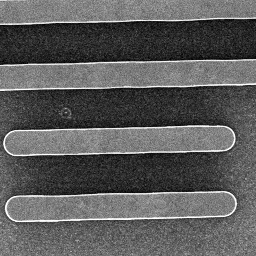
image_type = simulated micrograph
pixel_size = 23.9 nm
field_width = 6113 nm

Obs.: groups of lines, slits or small figures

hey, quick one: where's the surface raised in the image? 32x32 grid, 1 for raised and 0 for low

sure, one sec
11111111111111111111111111111111
11111111111111111111111111111111
11111111111111111111111100000000
00000000000000000000000000000000
00000000000000000000000000000000
00000000000000000000000000000000
00000000000000000000000000000000
00000000000000000000000000000011
11111111111111111111111111111111
11111111111111111111111111111111
11111111111111111111111111111110
00000000000000000000000000000000
00000000000000000000000000000000
00000000000000000000000000000000
00000000000000000000000000000000
00000000000000000000000000000000
01111111111111111111111111111000
01111111111111111111111111111000
01111111111111111111111111111000
00000000000000000000000000000000
00000000000000000000000000000000
00000000000000000000000000000000
00000000000000000000000000000000
00000000000000000000000000000000
00111111111111111111111111111000
01111111111111111111111111111100
01111111111111111111111111111000
00111111000000000000000000000000
00000000000000000000000000000000
00000000000000000000000000000000
00000000000000000000000000000000
00000000000000000000000000000000